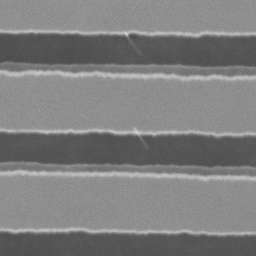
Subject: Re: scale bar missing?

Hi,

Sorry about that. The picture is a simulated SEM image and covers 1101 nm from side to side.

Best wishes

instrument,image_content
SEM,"lines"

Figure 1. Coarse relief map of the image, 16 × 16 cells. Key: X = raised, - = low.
XXXXXXXXXXXXXXXX
XXXXXXXXXXXXXXXX
----------------
----------------
XXXXXXXXXXXXXXXX
XXXXXXXXXXXXXXXX
XXXXXXXXXXXXXXXX
XXXXXXXXXXXXXXXX
----------------
----------------
XXXXXXXXXXXXXXXX
XXXXXXXXXXXXXXXX
XXXXXXXXXXXXXXXX
XXXXXXXXXXXXXXXX
-XX---XXXXXXXXXX
----------------